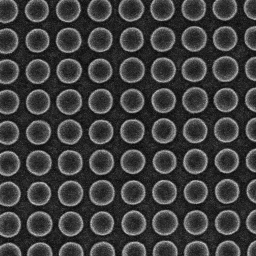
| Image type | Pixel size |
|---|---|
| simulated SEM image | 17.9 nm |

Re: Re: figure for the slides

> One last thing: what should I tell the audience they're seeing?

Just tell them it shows a regular array of raised bodies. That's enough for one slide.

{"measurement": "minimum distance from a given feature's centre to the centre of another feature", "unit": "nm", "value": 545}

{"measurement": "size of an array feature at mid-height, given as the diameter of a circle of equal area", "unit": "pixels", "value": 23.3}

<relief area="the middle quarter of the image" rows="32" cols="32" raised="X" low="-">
XXXX--XXXXXX--XXXXXX--XXXXX---XX
XXXX--XXXXXX--XXXXXX--XXXXXX--XX
XXXX--XXXXXX--XXXXXX--XXXXXX--XX
XXXX---XXXX----XXXX---XXXXX----X
XX------------------------------
--------------------------------
----------------XX------XX-----X
XXXX---XXXX----XXXX----XXXX---XX
XXXX---XXXXX--XXXXXX--XXXXXX--XX
XXXX--XXXXXX--XXXXXX--XXXXXX--XX
XXXX---XXXXX---XXXXX---XXXX---XX
XXX----XXXX-----XXX----XXXX----X
--------------------------------
--------------------------------
XXX-----XXX----XXXX----XXXX----X
XXXX---XXXXX---XXXXX--XXXXX---XX
XXXX--XXXXXX--XXXXXX--XXXXXX--XX
XXXX--XXXXXX--XXXXXX--XXXXXX--XX
XXXX---XXXXX---XXXX----XXXX----X
XXX-----XX------XX-------X------
--------------------------------
--------------------------------
XXX----XXXXX---XXXX----XXXX----X
XXXX---XXXXX---XXXXX--XXXXXX--XX
XXXX---XXXXX--XXXXXX--XXXXXX--XX
XXXX---XXXXX--XXXXXX---XXXXX--XX
XXXX---XXXXX---XXXX----XXXX----X
-X------XX----------------------
--------------------------------
-XX-----XXX------X------XX------
XXXX---XXXXX---XXXXX---XXXXX---X
XXXXX--XXXXX--XXXXXX--XXXXXX--XX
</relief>